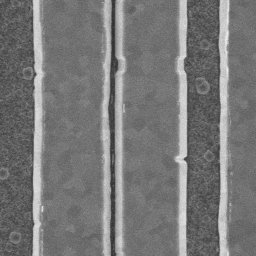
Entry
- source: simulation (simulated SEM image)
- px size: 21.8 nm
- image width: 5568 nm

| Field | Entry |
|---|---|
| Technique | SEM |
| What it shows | one or a few lines or trenches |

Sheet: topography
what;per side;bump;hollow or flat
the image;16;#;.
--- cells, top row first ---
..#########...##
..#########...##
..#########...##
..#########...##
..#########...##
..#########...##
..#########...##
..#########...##
..#########...##
..#########...##
..#########...##
..#########...##
..#########...##
..#########...##
..#########...##
..#########...##